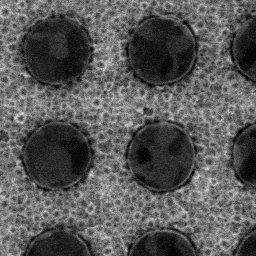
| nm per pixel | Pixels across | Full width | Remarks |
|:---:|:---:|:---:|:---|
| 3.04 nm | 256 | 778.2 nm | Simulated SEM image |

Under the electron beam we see raised bodies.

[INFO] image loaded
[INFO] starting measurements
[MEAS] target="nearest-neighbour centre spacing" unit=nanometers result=318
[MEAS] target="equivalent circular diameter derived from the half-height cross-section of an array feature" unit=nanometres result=203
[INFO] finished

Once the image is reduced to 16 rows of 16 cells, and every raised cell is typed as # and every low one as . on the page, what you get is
................
..###....##....#
..####..####...#
..####..####...#
..###....###...#
................
................
................
..###....###...#
..####..####...#
..###...####...#
..###....##.....
................
................
...#.....##.....
..###...####...#